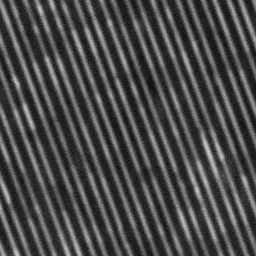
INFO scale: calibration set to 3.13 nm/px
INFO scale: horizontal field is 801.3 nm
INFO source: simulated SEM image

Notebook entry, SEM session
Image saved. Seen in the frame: parallel lines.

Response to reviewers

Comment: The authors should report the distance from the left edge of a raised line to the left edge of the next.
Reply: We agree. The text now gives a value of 37.3 nm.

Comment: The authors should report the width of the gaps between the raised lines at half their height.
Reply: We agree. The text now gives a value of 26.1 nanometers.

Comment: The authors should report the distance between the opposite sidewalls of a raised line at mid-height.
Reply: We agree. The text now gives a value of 8.8 nm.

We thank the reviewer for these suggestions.